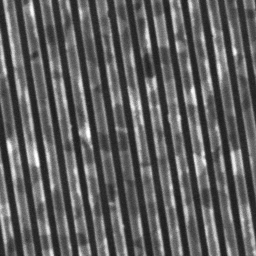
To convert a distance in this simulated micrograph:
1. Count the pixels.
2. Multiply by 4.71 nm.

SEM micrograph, parallel lines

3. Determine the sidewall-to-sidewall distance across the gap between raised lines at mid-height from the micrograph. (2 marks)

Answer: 40.1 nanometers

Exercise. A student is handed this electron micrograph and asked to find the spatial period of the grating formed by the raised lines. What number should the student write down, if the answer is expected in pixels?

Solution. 18.3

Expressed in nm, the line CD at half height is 45.5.